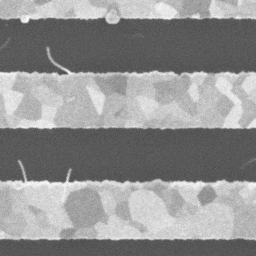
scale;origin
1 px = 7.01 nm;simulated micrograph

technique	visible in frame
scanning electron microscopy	lines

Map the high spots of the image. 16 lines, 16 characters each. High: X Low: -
XXXXXXXXXXXXXXXX
----------------
----------------
----------------
----------------
XXXXXXXXXXXXXXXX
XXXXXXXXXXXXXXXX
XXXXXXXXXXXXXXXX
----------------
----------------
----------------
XXXXXXXXXXXXXXXX
XXXXXXXXXXXXXXXX
XXXXXXXXXXXXXXXX
XXXXXXXXXXXXXXXX
----------------